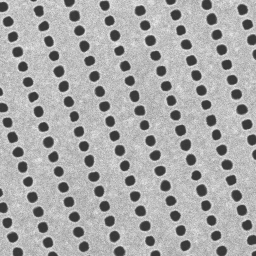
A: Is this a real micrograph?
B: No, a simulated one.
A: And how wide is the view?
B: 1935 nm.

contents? a regular array of holes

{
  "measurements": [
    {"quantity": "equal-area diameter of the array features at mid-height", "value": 76.8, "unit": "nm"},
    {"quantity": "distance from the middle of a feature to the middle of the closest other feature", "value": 0.118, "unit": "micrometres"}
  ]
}